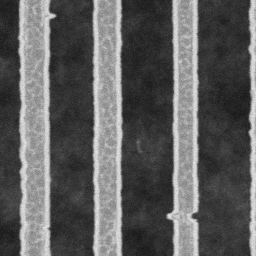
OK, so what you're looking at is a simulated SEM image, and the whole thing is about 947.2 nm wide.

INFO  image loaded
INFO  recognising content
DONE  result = one or a few lines or trenches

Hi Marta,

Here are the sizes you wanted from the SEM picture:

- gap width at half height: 0.209 microns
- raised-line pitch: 278 nanometers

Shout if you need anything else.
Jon